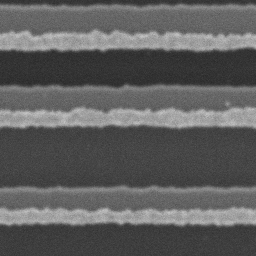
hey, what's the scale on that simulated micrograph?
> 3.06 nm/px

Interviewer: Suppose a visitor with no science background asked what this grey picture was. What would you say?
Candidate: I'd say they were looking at lines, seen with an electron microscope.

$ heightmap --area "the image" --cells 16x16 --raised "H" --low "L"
HHHHHHHHHHHHHHHH
HHHHHHHHHHHHHHHH
HHHHHHHHHHHHHHHH
LLLLLLLLLLLLLLLL
LLLLLLLLLLLLLLLL
HHHHHHHHHHHHHHHH
HHHHHHHHHHHHHHHH
HHHHHHHHHHHHHHHH
LLLLLLLLLLLLLLLL
LLLLLLLLLLLLLLLL
LLLLLLLLLLLLLLLL
LLLLLLLLLLLLLLLL
HHHHHHHHHHHHHHHH
HHHHHHHHHHHHHHHH
LLLLLLLLLLLLLLLL
LLLLLLLLLLLLLLLL